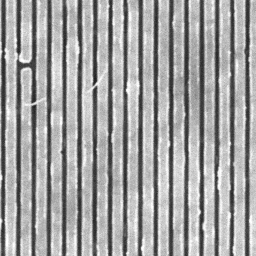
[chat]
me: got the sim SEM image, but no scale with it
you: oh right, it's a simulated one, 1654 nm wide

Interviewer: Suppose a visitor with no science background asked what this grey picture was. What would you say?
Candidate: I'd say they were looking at parallel lines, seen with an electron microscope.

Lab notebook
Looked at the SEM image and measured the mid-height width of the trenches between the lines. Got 33.1 nm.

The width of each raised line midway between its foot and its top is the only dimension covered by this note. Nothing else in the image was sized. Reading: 0.0614 micrometres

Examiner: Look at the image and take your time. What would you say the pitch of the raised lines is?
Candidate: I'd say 0.0986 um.